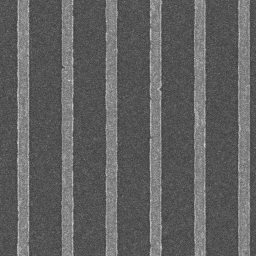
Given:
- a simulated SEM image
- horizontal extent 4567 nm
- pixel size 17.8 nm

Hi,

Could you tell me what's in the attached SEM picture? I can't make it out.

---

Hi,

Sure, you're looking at parallel lines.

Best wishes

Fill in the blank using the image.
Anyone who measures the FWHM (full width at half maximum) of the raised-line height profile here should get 10.6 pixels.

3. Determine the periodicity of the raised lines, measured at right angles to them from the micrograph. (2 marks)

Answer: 787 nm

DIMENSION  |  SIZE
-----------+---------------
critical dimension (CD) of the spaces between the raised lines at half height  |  600 nm